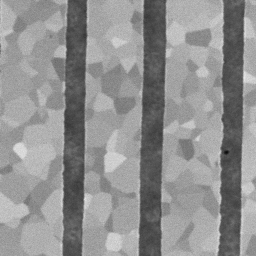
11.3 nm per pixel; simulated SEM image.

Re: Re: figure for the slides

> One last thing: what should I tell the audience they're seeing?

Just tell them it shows one or a few lines or trenches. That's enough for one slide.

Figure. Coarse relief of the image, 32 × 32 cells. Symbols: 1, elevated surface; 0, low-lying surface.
11111111000111111100011111110001
11111111000111111100011111110001
11111111000111111100011111110001
11111111000111111100011111110001
11111111000111111100011111110001
11111111000111111100011111110001
11111111000111111100011111110001
11111111000111111100011111110011
11111111000111111100011111110001
11111111000111111100011111110011
11111111000111111100011111110011
11111111000111111100011111110011
11111111000111111100011111110011
11111111000111111100011111110011
11111111000111111100011111110011
11111111000111111100011111110011
11111111000111111100111111110011
11111111000111111100111111110011
11111111000111111000111111110011
11111111000111111000111111110011
11111111000111111000111111100011
11111111000111111000111111110011
11111111000111111000111111110011
11111111000111111000111111100011
11111111000111111000111111110011
11111111000111111000111111110011
11111111000111111000111111100011
11111111001111111000111111110011
11111111001111111000111111100011
11111111001111111000111111100011
11111111001111111000111111100011
11111111001111111000111111100011